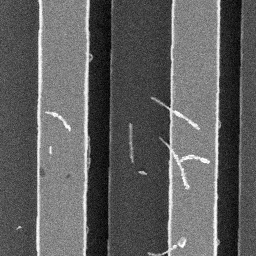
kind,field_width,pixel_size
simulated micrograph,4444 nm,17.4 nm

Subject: lines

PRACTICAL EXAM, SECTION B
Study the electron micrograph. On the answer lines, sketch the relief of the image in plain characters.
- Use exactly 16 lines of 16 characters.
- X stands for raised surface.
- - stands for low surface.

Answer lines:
---XXX-----XXX--
--XXXX-----XXX--
--XXXX-----XXX--
--XXXX-----XXX--
--XXXX-----XXX--
--XXX------XXX--
--XXX------XXX--
--XXX------XXX--
--XXX------XXX--
--XXX------XXX--
--XXX------XXX--
--XXX------XXX--
--XXX------XXX--
--XXX------XXX--
--XXX------XXX--
--XXX------XXX--